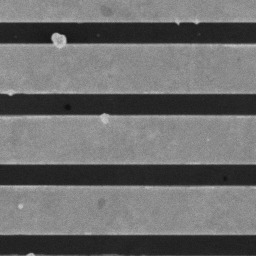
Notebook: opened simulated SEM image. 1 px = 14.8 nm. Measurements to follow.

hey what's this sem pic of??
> lines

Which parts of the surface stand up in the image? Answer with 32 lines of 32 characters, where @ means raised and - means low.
@@@@@@@@@@@@@@@@@@@@@@@@@@@@@@@@
@@@@@@@@@@@@@@@@@@@@@@@@@@@@@@@@
@@@@@@@@@@@@@@@@@@@@@@@@@@@@@@@@
--------------------------------
-------@------------------------
------@@@-----------------------
@@@@@@@@@@@@@@@@@@@@@@@@@@@@@@@@
@@@@@@@@@@@@@@@@@@@@@@@@@@@@@@@@
@@@@@@@@@@@@@@@@@@@@@@@@@@@@@@@@
@@@@@@@@@@@@@@@@@@@@@@@@@@@@@@@@
@@@@@@@@@@@@@@@@@@@@@@@@@@@@@@@@
@@@@@@@@@@@@@@@@@@@@@@@@@@@@@@@@
--------------------------------
--------------------------------
-------@@@@@@@@-@@@@@@@@@@------
@@@@@@@@@@@@@@@@@@@@@@@@@@@@@@@@
@@@@@@@@@@@@@@@@@@@@@@@@@@@@@@@@
@@@@@@@@@@@@@@@@@@@@@@@@@@@@@@@@
@@@@@@@@@@@@@@@@@@@@@@@@@@@@@@@@
@@@@@@@@@@@@@@@@@@@@@@@@@@@@@@@@
--------------------------------
--------------------------------
--------------------------------
@@@@@@@@@@@@@@@@@@@@@@@@@@@@@@@@
@@@@@@@@@@@@@@@@@@@@@@@@@@@@@@@@
@@@@@@@@@@@@@@@@@@@@@@@@@@@@@@@@
@@@@@@@@@@@@@@@@@@@@@@@@@@@@@@@@
@@@@@@@@@@@@@@@@@@@@@@@@@@@@@@@@
@@@@@@@@@@@@@@@@@@@@@@@@@@@@@@@@
--------------------------------
--------------------------------
--------------------------------